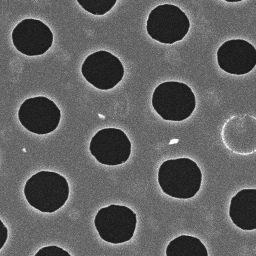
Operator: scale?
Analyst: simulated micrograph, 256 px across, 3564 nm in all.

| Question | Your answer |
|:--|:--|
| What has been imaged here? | a regular array of holes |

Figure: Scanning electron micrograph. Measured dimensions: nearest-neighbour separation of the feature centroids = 1060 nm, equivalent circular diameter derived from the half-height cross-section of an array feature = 567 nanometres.